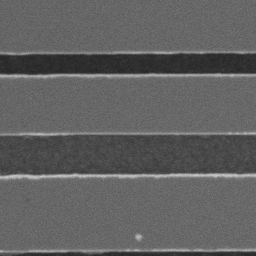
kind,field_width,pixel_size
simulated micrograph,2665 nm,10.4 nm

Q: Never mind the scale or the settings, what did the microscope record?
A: lines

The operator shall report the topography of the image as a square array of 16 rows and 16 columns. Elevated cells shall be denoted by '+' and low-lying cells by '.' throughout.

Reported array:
++++++++++++++++
++++++++++++++++
++++++++++++++++
................
................
++++++++++++++++
++++++++++++++++
++++++++++++++++
................
................
................
++++++++++++++++
++++++++++++++++
++++++++++++++++
++++++++++++++++
++++++++++++++++